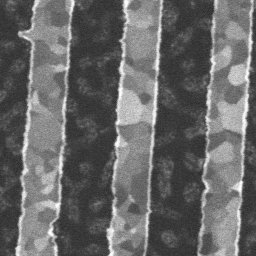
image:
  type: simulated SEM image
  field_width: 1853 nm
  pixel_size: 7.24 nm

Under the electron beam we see one or a few lines or trenches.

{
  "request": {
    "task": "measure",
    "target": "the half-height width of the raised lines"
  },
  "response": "265 nanometers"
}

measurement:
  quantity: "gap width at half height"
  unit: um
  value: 0.39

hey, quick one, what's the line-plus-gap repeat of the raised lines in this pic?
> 655 nanometres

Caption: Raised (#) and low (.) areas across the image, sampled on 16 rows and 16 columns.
..###...##...###
..##....##...###
..##....##...###
..##....##...###
..##....##...##.
..##....##...##.
..##...###...##.
..##...###...##.
..##...###...##.
..##...##....##.
..##...##....##.
.###...##....##.
.###...##....##.
.###...##....##.
.##....##....##.
.##....##...###.